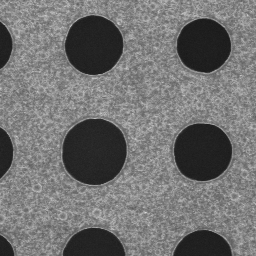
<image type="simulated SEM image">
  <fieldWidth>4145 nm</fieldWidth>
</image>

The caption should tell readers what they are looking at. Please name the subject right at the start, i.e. holes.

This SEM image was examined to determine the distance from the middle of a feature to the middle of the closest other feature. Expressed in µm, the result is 1.73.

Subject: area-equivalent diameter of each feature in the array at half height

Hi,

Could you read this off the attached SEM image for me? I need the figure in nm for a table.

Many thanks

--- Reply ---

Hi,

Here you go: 951